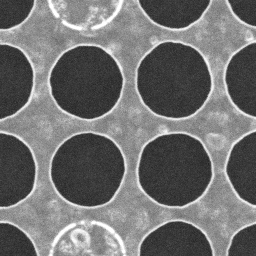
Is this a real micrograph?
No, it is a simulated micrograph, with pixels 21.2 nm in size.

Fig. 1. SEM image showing holes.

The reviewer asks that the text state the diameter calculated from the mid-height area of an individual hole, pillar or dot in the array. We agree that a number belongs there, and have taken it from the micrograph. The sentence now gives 1570 nm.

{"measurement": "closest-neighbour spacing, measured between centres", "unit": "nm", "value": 1850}